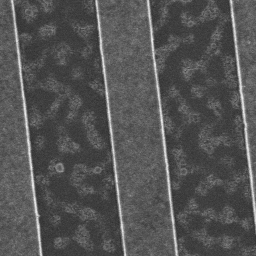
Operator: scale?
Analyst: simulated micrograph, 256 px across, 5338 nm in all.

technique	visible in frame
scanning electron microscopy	one or a few lines or trenches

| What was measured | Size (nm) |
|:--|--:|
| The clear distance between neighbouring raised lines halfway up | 1740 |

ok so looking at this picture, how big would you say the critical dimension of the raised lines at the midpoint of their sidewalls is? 1060 nm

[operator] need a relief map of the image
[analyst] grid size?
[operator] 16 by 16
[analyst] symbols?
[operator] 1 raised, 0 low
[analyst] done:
1000001110000011
1000001110000001
1000001110000001
1000001111000001
1000000111000001
1000000111000001
1100000111000001
1100000111000001
1100000111000001
1100000111000000
1100000111000000
1100000111100000
1100000111100000
1100000011100000
1100000011100000
1100000011100000